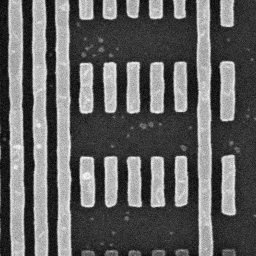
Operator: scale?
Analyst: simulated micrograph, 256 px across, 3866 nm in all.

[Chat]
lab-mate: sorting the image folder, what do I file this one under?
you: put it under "wiring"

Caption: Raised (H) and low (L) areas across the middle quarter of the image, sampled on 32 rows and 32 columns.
HLLLHHHLLLHHHLLLHHHLLLHHHLLLHHHL
HLLLHHHLLLHHHLLLHHHLLLHHHLLLHHHL
HLLLHHHLLLHHHLLLHHHLLLHHHLLLHHHL
HLLLHHHLLLHHHLLLHHHLLLHHHLLLHHHL
HLLLHHHLLLHHHLLLHHHLLLHHHLLLHHHL
HLLLHHHLLLHHHLLLHHHLLLHHHLLLHHHL
HLLLHHHLLLHHHLLLHHHLLLHHHLLLHHHL
HLLLHHHLLLHHHLLLHHHLLLHHHLLLHHHL
HLLLHHHLLLHHHLLLHHHLLLHHHLLLHHHL
HLLLHHHLLLHHHLLLHHHLLLHHHLLLHHHL
HLLLHHHLLLHHHLLLHHHLLLHHHLLLHHHL
HLLLHHHLLLHHHLLLHHHLLLHHHLLLHHLL
HLLLLLLLLLLLLLLLLLLLLLLLLLLLLLLL
HLLLLLLLLLLLLLLLLLLLLLLLLLLLLLLL
HLLLLLLLLLLLLLLLLLLLLLLLLLLLLLLL
HLLLLLLLLLLLLLLLLLLLLLLLLLLLLLLL
HLLLLLLLLLLLLLLLLLLLLLLLLLLLLLLL
HLLLLLLLLLLLLLLLLLLLLLLLLLLLLLLL
HLLLLLLLLLLLLLLLLLLLLLLLLLLLLLLL
HLLLLLLLLLLLLLLLLLLLLLLLLLLLLLLL
HLLLLLLLLLLLLLLLLLLLLLLLLLLLLLLL
HLLLLLLLLLLLLLLLLLLLLLLLLLLLLLLL
HLLLLLLLLLLLLLLLLLLLLLLLLLLLLLLL
HLLLHHHLLLHHHLLLHHHLLLHHLLLLHHHL
HLLLHHHLLLHHHLLLHHHLLLHHHLLLHHHL
HLLLHHHLLLHHHLLLHHHLLLHHHLLLHHHL
HLLLHHHLLLHHHLLLHHHLLLHHHLLLHHHL
HLLLHHHLLLHHHLLLHHHLLLHHHLLLHHHL
HHLLHHHHLLHHHLLLHHHLLLHHHLLLHHHL
HHLLHHHHLLHHHLLLHHHLLLHHHLLLHHHL
HLLLHHHHLLHHHLLLHHHLLLHHHLLLHHHL
HLLLHHHHLLHHHLLLHHHLLLHHHLLLHHHL